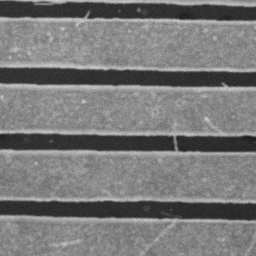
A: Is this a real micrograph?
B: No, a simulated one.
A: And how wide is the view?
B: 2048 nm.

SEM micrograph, lines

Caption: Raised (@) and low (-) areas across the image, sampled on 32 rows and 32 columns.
-----------------------------@@@
--------------------------------
@@@@@@@@@@@@@@@@@---------------
@@@@@@@@@@@@@@@@@@@@@@@@@@@@@@@@
@@@@@@@@@@@@@@@@@@@@@@@@@@@@@@@@
@@@@@@@@@@@@@@@@@@@@@@@@@@@@@@@@
@@@@@@@@@@@@@@@@@@@@@@@@@@@@@@@@
@@@@@@@@@@@@@@@@@@@@@@@@@@@@@@@@
--------------@@@@@@@@@@@@@@@@@@
--------------------------------
--------------------------------
@@@@@@@@@@@@@@@@@@@@@@@@@@@@@@@@
@@@@@@@@@@@@@@@@@@@@@@@@@@@@@@@@
@@@@@@@@@@@@@@@@@@@@@@@@@@@@@@@@
@@@@@@@@@@@@@@@@@@@@@@@@@@@@@@@@
@@@@@@@@@@@@@@@@@@@@@@@@@@@@@@@@
-------@@@@@@@@@@@@@@@@@@@@@@@@@
--------------------------------
--------------------------------
@@@@@@@@@@@@@@@@@@@@@@@@@@@@@@@@
@@@@@@@@@@@@@@@@@@@@@@@@@@@@@@@@
@@@@@@@@@@@@@@@@@@@@@@@@@@@@@@@@
@@@@@@@@@@@@@@@@@@@@@@@@@@@@@@@@
@@@@@@@@@@@@@@@@@@@@@@@@@@@@@@@@
@@@@@@@@@@@@@@@@@@@@@@@@@@@@@@@@
--------------------------------
--------------------------------
@@@@@@@@@@@@@@@@@@@@@@@@@-------
@@@@@@@@@@@@@@@@@@@@@@@@@@@@@@@@
@@@@@@@@@@@@@@@@@@@@@@@@@@@@@@@@
@@@@@@@@@@@@@@@@@@@@@@@@@@@@@@@@
@@@@@@@@@@@@@@@@@@@@@@@@@@@@@@@@